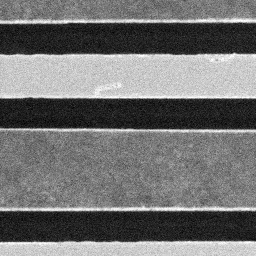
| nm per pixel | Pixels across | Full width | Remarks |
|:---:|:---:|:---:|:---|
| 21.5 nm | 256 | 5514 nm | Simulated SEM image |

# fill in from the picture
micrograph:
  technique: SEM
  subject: lines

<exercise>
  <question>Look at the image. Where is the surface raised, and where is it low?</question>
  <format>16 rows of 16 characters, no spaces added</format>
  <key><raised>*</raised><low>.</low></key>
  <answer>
****************
................
................
****************
****************
****************
................
................
****************
****************
****************
****************
****************
................
................
****************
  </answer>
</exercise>